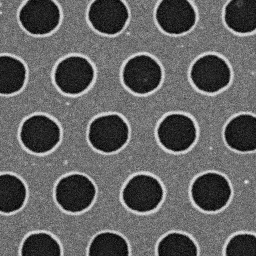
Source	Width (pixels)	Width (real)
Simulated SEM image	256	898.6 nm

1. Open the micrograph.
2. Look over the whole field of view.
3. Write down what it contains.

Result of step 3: a regular array of holes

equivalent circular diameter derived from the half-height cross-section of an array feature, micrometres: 0.142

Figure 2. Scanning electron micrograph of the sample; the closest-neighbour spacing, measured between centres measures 67.7 pixels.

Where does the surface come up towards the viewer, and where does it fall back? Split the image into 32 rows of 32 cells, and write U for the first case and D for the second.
UUUDDDDUUUUDDDDDUUUUDDDDUUUUDDDD
UUDDDDDDUUUDDDDDUUUDDDDDDUUUDDDD
UUDDDDDDUUUDDDDDUUUDDDDDDUUUDDDD
UUUDDDDUUUUUDDDDUUUUDDDDUUUUUDDD
UUUUUUUUUUUUUUUUUUUUUUUUUUUUUUUU
UUUUUUUUUUUUUUUUUUUUUUUUUUUUUUUU
UUUUUUUUUUUUUUUUUUUUUUUUUUUUUUUU
DDUUUUUUDDDUUUUUDDDUUUUUDDDDUUUU
DDDUUUUDDDDDUUUDDDDDUUUUDDDDDUUU
DDDUUUUDDDDDUUUDDDDDUUUUDDDDDUUU
DDDUUUUDDDDUUUUDDDDDUUUUDDDDDUUU
DDUUUUUUDDUUUUUUUDDUUUUUUDDUUUUU
UUUUUUUUUUUUUUUUUUUUUUUUUUUUUUUU
UUUUUUUUUUUUUUUUUUUUUUUUUUUUUUUU
UUUUDDUUUUUUDDDUUUUUUDDDUUUUUDDD
UUUDDDDUUUUDDDDDUUUUDDDDUUUUDDDD
UUDDDDDDUUUDDDDDUUUUDDDDDUUUDDDD
UUUDDDDDUUUDDDDDUUUUDDDDUUUUDDDD
UUUDDDDUUUUUDDDUUUUUUDDDUUUUUDDD
UUUUUUUUUUUUUUUUUUUUUUUUUUUUUUUU
UUUUUUUUUUUUUUUUUUUUUUUUUUUUUUUU
UUUUUUUUUUUUUUUUUUUUUUUUUUDUUUUU
DDDUUUUDDDDUUUUUDDDDUUUUDDDDDUUU
DDDUUUUDDDDDUUUDDDDDUUUUDDDDDUUU
DDDUUUUDDDDDUUUDDDDDUUUUDDDDDUUU
DDDUUUUDDDDUUUUDDDDDUUUUDDDDUUUU
DDUUUUUUDDUUUUUUUDDUUUUUUUDUUUUU
UUUUUUUUUUUUUUUUUUUUUUUUUUUUUUUU
UUUUUUUUUUUUUUUUUUUUUUUUUUUUUUUU
UUUDDDDUUUUUDDDUUUUUUDDDUUUUUDDD
UUUDDDDUUUUDDDDDUUUUDDDDUUUUDDDD
UUUDDDDDUUUDDDDDUUUUDDDDDUUUDDDD